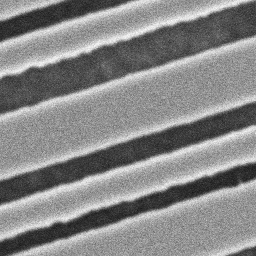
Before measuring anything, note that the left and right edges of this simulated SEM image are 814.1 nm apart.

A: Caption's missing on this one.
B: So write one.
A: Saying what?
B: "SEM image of lines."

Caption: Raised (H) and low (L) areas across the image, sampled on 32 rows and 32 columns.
HHHHHHHLLLLLLLLHHHHHHHHHHHHHHHLL
HHHLLLLLLLLLHHHHHHHHHHHHHHHLLLLL
HLLLLLLLLHHHHHHHHHHHHHHHLLLLLLLL
LLLLLLHHHHHHHHHHHHHHLLLLLLLLLLLL
LLHHHHHHHHHHHHHHHLLLLLLLLLLLLLLL
HHHHHHHHHHHHHHLLLLLLLLLLLLLLLHHH
HHHHHHHHHHHLLLLLLLLLLLLLLHHHHHHH
HHHHHHHHLLLLLLLLLLLLLLLHHHHHHHHH
HHHHLLLLLLLLLLLLLLLHHHHHHHHHHHHH
HLLLLLLLLLLLLLLLHHHHHHHHHHHHHHHH
LLLLLLLLLLLLLHHHHHHHHHHHHHHHHHHH
LLLLLLLLLLHHHHHHHHHHHHHHHHHHHHHH
LLLLLLHHHHHHHHHHHHHHHHHHHHHHHHHH
LLLHHHHHHHHHHHHHHHHHHHHHHHHHHLLL
HHHHHHHHHHHHHHHHHHHHHHHHHHLLLLLL
HHHHHHHHHHHHHHHHHHHHHHHLLLLLLLLL
HHHHHHHHHHHHHHHHHHHLLLLLLLLLLHHH
HHHHHHHHHHHHHHHHLLLLLLLLLLHHHHHH
HHHHHHHHHHHHHLLLLLLLLLLHHHHHHHHH
HHHHHHHHHHLLLLLLLLLHHHHHHHHHHHHH
HHHHHHLLLLLLLLLLHHHHHHHHHHHHHHHL
HHHLLLLLLLLLLHHHHHHHHHHHHHHHLLLL
LLLLLLLLLLHHHHHHHHHHHHHHLLLLLLLL
LLLLLLLHHHHHHHHHHHHHHLLLLLLLHHHH
LLLLHHHHHHHHHHHHHHLLLLLLLHHHHHHH
HHHHHHHHHHHHHHLLLLLLLLHHHHHHHHHH
HHHHHHHHHHHLLLLLLLLHHHHHHHHHHHHH
HHHHHHHHHLLLLLLHHHHHHHHHHHHHHHHH
HHHHHHLLLLLLLHHHHHHHHHHHHHHHHHHH
HHLLLLLLLHHHHHHHHHHHHHHHHHHHHHHH
LLLLLLHHHHHHHHHHHHHHHHHHHHHHHHHH
LLLHHHHHHHHHHHHHHHHHHHHHHHHHHHLL